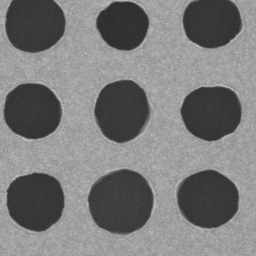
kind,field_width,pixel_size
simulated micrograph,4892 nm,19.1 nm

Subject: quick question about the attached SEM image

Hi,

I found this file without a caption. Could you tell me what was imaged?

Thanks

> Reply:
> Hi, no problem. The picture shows holes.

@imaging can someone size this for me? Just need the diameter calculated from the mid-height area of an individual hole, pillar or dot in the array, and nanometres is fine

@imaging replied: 1120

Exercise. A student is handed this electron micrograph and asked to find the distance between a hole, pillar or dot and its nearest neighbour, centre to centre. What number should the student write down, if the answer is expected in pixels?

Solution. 85.5